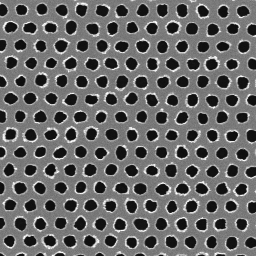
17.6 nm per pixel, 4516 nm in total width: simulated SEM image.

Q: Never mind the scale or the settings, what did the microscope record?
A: a regular array of holes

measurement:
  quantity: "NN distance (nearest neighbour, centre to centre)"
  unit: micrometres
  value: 0.344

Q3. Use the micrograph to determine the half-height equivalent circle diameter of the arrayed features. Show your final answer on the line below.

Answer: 201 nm